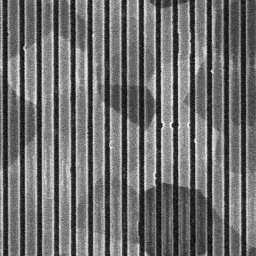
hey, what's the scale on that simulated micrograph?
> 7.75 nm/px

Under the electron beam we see parallel lines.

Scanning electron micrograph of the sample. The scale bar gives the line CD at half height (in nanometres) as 85.2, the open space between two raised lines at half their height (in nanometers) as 46.5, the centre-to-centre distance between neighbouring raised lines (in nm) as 132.